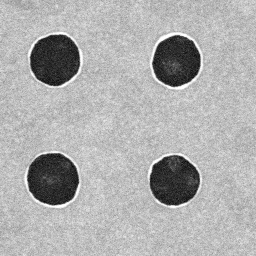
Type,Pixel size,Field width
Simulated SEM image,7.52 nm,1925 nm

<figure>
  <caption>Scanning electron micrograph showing holes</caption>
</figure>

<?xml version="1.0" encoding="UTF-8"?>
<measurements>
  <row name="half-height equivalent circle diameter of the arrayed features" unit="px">52.4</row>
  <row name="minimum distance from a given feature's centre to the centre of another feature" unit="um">0.899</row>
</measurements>